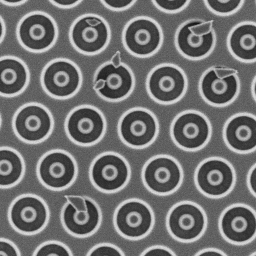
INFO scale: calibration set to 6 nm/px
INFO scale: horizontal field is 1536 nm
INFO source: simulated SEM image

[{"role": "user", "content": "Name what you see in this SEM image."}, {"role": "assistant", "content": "an array of small figures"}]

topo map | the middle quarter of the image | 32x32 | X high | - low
---XXXXXXX---X-XXXXXXXXX---XXXXX
----XXXXX-------XXXXXX-------XXX
----XXXX---------XXXXX--------XX
X---XXXX---XXX---XXXX----X----XX
X---XXXXXX-XXX---XXXX---XXX----X
----XXXXXX-XXX---XXXX---XXX----X
---XXXXXX--------XXXX---------XX
--XXXXXXX-------XXXXXX--------XX
XXXXXXXXXX-----XXXXXXXX------XXX
XXXXXXXXXXXXXXXXXXXXXXXX---XXXXX
XXXXXXXXXXXXXXXXXXXXXXXXXXXXXXXX
XX------XXXXXXXXX---XXXXXXXXXXXX
XX-------XXXXXXX------XXXXXXX---
X---------XXXXX--------XXXXX----
X---XXX---XXXX----X----XXXX-----
X---XXX---XXXX---XXX---XXXX----X
X---XXX---XXXX---XXX---XXXX---XX
X---------XXXX----X----XXXX---XX
XX-------XXXXX---------XXXX-----
XXX-----XXXXXXX-------XXXXXX----
XXXXXXXXXXXXXXXXX---XXXXXXXXX---
XXXXXXXXXXXXXXXXXXXXXXXXXXXXXXX-
-XXXXXXXXXX--XXXXXXXXXXXXXXXXXXX
--XXXXXX-------XXXXXXXX---XXXXXX
---XXXX--------XXXXXX-------XXXX
---XXXX----X----XXXX---------XXX
---XXXX---XXX---XXXX----XX---XXX
---XXXX---XXX---XXXX---XXX---XXX
---XXXX---XX----XXXX---XXX---XXX
--XXXXX---------XXXX---------XXX
-XXXXXXX-------XXXXXX-------XXXX
XXXXXXXXX----XXXXXXXXX------XXXX